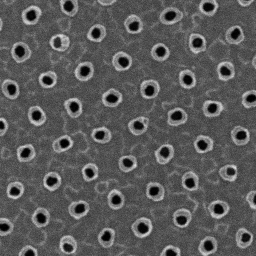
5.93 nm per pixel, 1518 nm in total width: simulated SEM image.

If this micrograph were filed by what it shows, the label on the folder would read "a regular array of ring-shaped raised bodies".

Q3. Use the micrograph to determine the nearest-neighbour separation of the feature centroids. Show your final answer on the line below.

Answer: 0.218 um